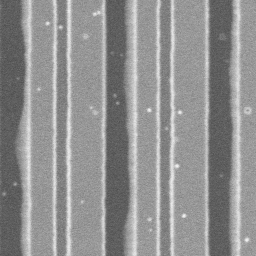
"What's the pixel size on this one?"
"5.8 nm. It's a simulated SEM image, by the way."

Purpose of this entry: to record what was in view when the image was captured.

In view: lines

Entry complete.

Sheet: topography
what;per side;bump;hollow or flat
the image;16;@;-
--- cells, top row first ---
--@@@@--@@@@@--@
--@@@@--@@@@@--@
--@@@@--@@@@@--@
--@@@@--@@@@@--@
--@@@@--@@@@@--@
--@@@@--@@@@@--@
--@@@@--@@@@@--@
--@@@@--@@@@@--@
--@@@@--@@@@@--@
--@@@@--@@@@@--@
--@@@@--@@@@@--@
--@@@@--@@@@@--@
--@@@@--@@@@@--@
--@@@@--@@@@@--@
--@@@@--@@@@@--@
--@@@@--@@@@@--@